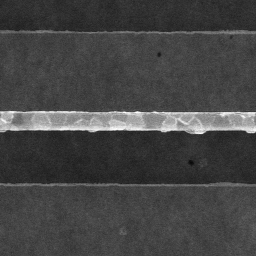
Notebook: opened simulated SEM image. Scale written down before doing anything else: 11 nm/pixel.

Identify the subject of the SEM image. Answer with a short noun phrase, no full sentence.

lines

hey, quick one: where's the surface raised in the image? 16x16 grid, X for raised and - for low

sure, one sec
----------------
----------------
XXXXXXXXXXXXXXXX
XXXXXXXXXXXXXXXX
XXXXXXXXXXXXXXXX
XXXXXXXXXXXXXXXX
XXXXXXXXXXXXXXXX
XXXXXXXXXXXXXXXX
----------------
----------------
----------------
----------------
XXXXXXXXXXXXXXXX
XXXXXXXXXXXXXXXX
XXXXXXXXXXXXXXXX
XXXXXXXXXXXXXXXX